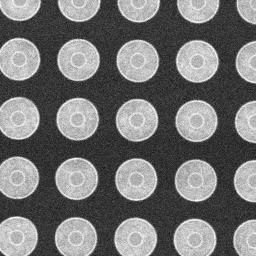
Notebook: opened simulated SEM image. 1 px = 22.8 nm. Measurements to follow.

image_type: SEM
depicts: an array of small figures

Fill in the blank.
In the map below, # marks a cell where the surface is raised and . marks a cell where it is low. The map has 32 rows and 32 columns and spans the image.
.....##.....###.....##.....###..
....####....###....####....###..
################..######..#####.
################################
################################
#...####...#####..#####...#####.
.....###....###....###.....###..
.....##.....###.....##.....###..
.....###....###.....##.....###..
#...####...#####...####...####..
################################
################################
#..######..#####################
....####....###....####...####..
.....##.....###.....##.....###..
.....##.....###.....##.....###..
....####....###....####....###..
########################.######.
################################
################################
....####...#####...####...#####.
.....##.....###....###.....###..
.....##.....###.....##.....##...
....###.....###....###.....###..
#..#####...#####..#####...####..
################################
################################
#..######.######..######.#######
....###.....###....###....####..
.....##.....##.....###.....##...
....###.....###....###.....##...
....####...####....###....####..